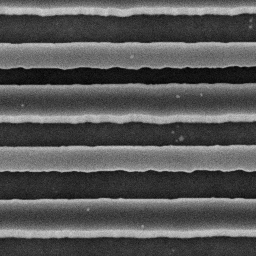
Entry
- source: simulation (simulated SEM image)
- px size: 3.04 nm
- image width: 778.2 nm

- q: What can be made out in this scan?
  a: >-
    lines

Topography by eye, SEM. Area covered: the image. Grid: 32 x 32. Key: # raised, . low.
################################
.###################.#########..
................................
................................
................................
........######.###.####.########
################################
################################
##.#...##...##..##.#..#.........
................................
.................#...#.#.#.#...#
################################
################################
################################
################################
................................
................................
................................
################################
################################
################################
..........##...........#........
................................
................................
................................
################################
################################
################################
################################
................................
................................
................................